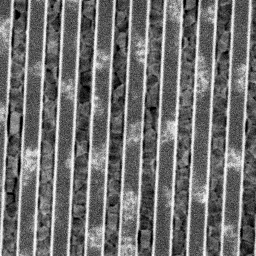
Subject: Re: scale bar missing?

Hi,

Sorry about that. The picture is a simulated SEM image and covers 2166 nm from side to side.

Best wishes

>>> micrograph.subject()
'parallel lines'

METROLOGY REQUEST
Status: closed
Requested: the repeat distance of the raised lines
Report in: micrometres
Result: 0.287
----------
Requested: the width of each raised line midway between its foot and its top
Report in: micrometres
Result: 0.149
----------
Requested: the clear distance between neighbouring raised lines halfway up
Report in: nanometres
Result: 140